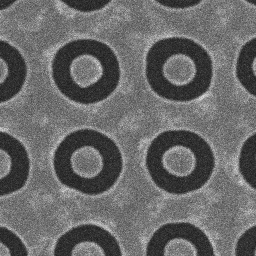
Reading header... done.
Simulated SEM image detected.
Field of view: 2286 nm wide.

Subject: ring-shaped grooves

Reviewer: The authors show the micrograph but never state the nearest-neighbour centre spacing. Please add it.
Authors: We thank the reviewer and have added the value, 0.815 um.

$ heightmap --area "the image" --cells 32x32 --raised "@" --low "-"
--@@@@@@------@@@@@@-----@@@@@@-
@@@@@@@@@@@@@@@@@@@@@@@@@@@@@@@@
@@@@@@@@@@@@@@@@@@@@@@@@@@@@@@@@
@@@@@@@@@@@@@@@@@@@@@@@@@@@@@@@@
@@@@@@@@@@@@@@@@@@@@@@@@@@@@@@@@
-@@@@@@@-----@@@@@@------@@@@@@-
--@@@@@-------@@@@@-------@@@@--
---@@@@--@@@---@@@---@@@--@@@@--
@--@@@---@@@@--@@@--@@@@---@@---
@--@@@@--@@@@--@@@---@@@---@@@--
---@@@@---@@---@@@@---@---@@@@--
--@@@@@@------@@@@@-------@@@@@-
-@@@@@@@@----@@@@@@@@---@@@@@@@@
@@@@@@@@@@@@@@@@@@@@@@@@@@@@@@@@
@@@@@@@@@@@@@@@@@@@@@@@@@@@@@@@@
@@@@@@@@@@@@@@@@@@@@@@@@@@@@@@@@
@@@@@@@@@---@@@@@@@@----@@@@@@@@
--@@@@@@------@@@@@-------@@@@@-
---@@@@---@@---@@@@---@---@@@@--
@--@@@@--@@@@--@@@--@@@@---@@@--
@---@@@--@@@@--@@@--@@@@---@@@--
@---@@@--@@@---@@@@--@@@---@@@--
---@@@@--------@@@@-------@@@@@-
---@@@@@@-----@@@@@@-----@@@@@@@
@@@@@@@@@@@@@@@@@@@@@@@@@@@@@@@@
@@@@@@@@@@@@@@@@@@@@@@@@@@@@@@@@
@@@@@@@@@@@@@@@@@@@@@@@@@@@@@@@@
@@@@@@@@@@@@@@@@@@@@@@@@@@@@@@@@
-@@@@@@@@----@@@@@@@-----@@@@@@-
--@@@@@@------@@@@@-------@@@@--
---@@@@---@@---@@@---@@@--@@@---
@--@@@@--@@@@--@@@---@@@---@@---